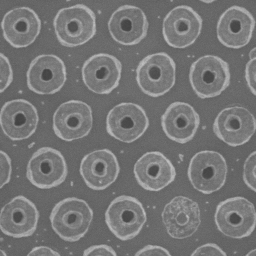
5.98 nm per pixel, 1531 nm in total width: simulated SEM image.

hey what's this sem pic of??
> a regular array of ring-shaped raised bodies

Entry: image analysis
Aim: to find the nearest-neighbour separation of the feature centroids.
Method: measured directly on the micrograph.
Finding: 0.317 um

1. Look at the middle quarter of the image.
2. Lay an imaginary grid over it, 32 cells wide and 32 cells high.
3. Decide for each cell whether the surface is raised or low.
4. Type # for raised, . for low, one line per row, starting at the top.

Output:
.....#########.....###.#####....
.....####..###.....##...###.....
.....###...###....###...###.....
.....###..####....####..####....
.....########......########.....
......#######......########.....
.......#####........######......
.....................###........
................................
.##.............................
######.......#####.........####.
######......#######.......######
#######....#########.....#######
#...###....####..####....####.##
#...###....###...####....###...#
#..####....###...####....###..##
######.....#########.....#######
#####.......#######.......######
###..........######........####.
...............##...............
................................
................................
......######........####........
.....########......######.......
.....####.###.....########......
....####..####....###...###.....
....###...####....###...###....#
....####..###.....###..#####...#
.....########.....#########.....
......######.......#######......
.......####.........######......
.......................#........